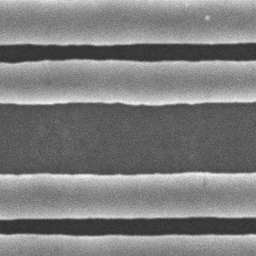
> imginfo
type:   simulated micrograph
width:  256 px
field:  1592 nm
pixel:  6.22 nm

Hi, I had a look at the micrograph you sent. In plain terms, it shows lines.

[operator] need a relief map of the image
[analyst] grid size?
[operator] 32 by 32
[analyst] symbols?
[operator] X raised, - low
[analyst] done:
XXXXXXXXXXXXXXXXXXXXXXXXXXXXXXXX
XXXXXXXXXXXXXXXXXXXXXXXXXXXXXXXX
XXXXXXXXXXXXXXXXXXXXXXXXXXXXXXXX
XXXXXXXXXXXXXXXXXXXXXXXXXXXXXXXX
XXXXXXXXXXXXXXXXXXXXXXXXXXXXXXXX
XXXXXXXXXXXXXXXXX--------XX-----
--------------------------------
---------XX---------------------
XXXXXXXXXXXXXXXXXXXXXXXXXXXXXXXX
XXXXXXXXXXXXXXXXXXXXXXXXXXXXXXXX
XXXXXXXXXXXXXXXXXXXXXXXXXXXXXXXX
XXXXXXXXXXXXXXXXXXXXXXXXXXXXXXXX
XXXXXXXXXXXXXXXXXXXXXXXXXXXXXXXX
--------------------------------
--------------------------------
--------------------------------
--------------------------------
--------------------------------
--------------------------------
--------------------------------
--------------------------------
--------------------------------
XXXXXXXXXXXXXXXXXXXXXXXXXXXXXXXX
XXXXXXXXXXXXXXXXXXXXXXXXXXXXXXXX
XXXXXXXXXXXXXXXXXXXXXXXXXXXXXXXX
XXXXXXXXXXXXXXXXXXXXXXXXXXXXXXXX
XXXXXXXXXXXXXXXXXXXXXXXXXXXXXXXX
--------------------------------
--------------------------------
XXXXXXXXX----XXXX---XXXXXXXXXXXX
XXXXXXXXXXXXXXXXXXXXXXXXXXXXXXXX
XXXXXXXXXXXXXXXXXXXXXXXXXXXXXXXX